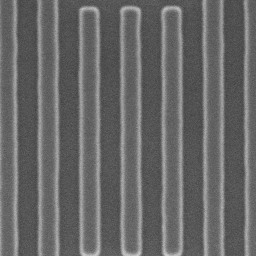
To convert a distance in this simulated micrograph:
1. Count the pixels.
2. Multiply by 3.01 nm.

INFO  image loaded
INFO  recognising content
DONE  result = groups of lines, slits or small figures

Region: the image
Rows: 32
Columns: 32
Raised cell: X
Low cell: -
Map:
XX---XX-------------------XX---X
XX---XX---XX---XX---XXX---XX---X
XX---XX---XX---XX---XXX---XX---X
XX---XX---XX---XX---XXX---XX---X
XX---XX---XX---XX---XXX---XX---X
XX---XX---XX---XX---XXX---XX---X
XX---XX---XX---XX---XXX---XX---X
XX---XX---XX---XX---XXX---XX---X
XX---XX---XX---XX---XXX---XX---X
XX---XX---XX---XX---XXX---XX---X
XX---XX---XX---XX---XXX---XX---X
XX---XX---XX---XX---XXX---XX---X
XX---XX---XX---XX---XXX---XX---X
XX---XX---XX---XX---XXX---XX---X
XX---XX---XX---XX---XXX---XX---X
XX---XX---XX---XX---XXX---XX---X
XX---XX---XX---XX---XXX---XX---X
XX---XX---XX---XX---XXX---XX---X
XX---XX---XX---XX---XXX---XX---X
XX---XX---XX---XX---XXX---XX---X
XX---XX---XX---XX---XXX---XX---X
XX---XX---XX---XX---XXX---XX---X
XX---XX---XX---XX---XXX---XX---X
XX---XX---XX---XX---XXX---XX---X
XX---XX---XX---XX---XXX---XX---X
XX---XX---XX---XXX--XXX---XX---X
XX---XX---XX---XXX--XXX---XX---X
XX---XX---XX---XXX--XXX---XX---X
XX---XX---XX---XXX--XXX---XX---X
XX---XX---XX---XX---XXX---XX---X
XX---XX---XX---XXX--XXX---XX---X
XX---XX---XX---XX---XXX---XX---X